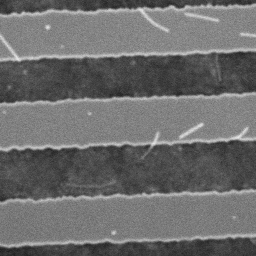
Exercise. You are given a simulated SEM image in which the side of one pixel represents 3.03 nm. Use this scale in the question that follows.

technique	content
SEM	lines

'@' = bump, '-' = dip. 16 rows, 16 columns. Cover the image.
---------@@@@@@@
@@@@@@@@@@@@@@@@
@@@@@@@@@@@@@@@@
@@@@@@@@--------
----------------
----------------
@@@@@@@@@@@@@@@@
@@@@@@@@@@@@@@@@
@@@@@@@@@@@@@@@@
----------------
----------------
----------------
-@@@@@@@@@@@@@@@
@@@@@@@@@@@@@@@@
@@@@@@@@@@@@@@@@
----------------